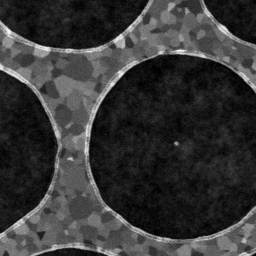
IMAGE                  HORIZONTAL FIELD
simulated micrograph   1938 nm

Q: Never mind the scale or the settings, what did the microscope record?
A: holes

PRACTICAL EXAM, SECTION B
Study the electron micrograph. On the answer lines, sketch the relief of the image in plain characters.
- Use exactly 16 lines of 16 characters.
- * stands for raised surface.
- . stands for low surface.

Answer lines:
.........****...
........******..
**.....********.
**********..****
********.......*
..*****.........
...***..........
...***..........
...***..........
....**..........
...***..........
...***..........
...***..........
..******.......*
*********.....**
****************